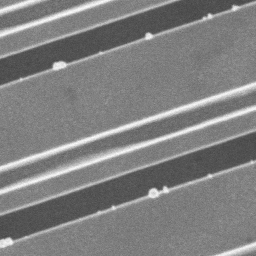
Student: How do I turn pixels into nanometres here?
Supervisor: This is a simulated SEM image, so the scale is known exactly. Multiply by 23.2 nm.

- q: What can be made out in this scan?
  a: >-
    lines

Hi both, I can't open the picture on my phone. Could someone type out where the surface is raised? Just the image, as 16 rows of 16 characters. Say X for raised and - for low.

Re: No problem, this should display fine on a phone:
XXXXXXXXXX-----X
XXXXXXX-----XXXX
XXX------XXXXXXX
------XXXXXXXXXX
---XXXXXXXXXXXXX
XXXXXXXXXXXXXXXX
XXXXXXXXXXXXXXXX
XXXXXXXXXXXXXXXX
XXXXXXXXXXXXXXX-
XXXXXXXXXXXX----
XXXXXXXXX------X
XXXXXX------XXXX
XXX------XXXXXXX
------XXXXXXXXXX
---XXXXXXXXXXXXX
XXXXXXXXXXXXXXXX